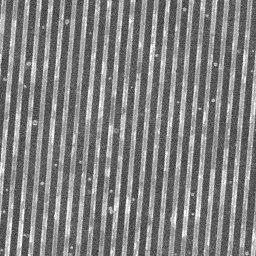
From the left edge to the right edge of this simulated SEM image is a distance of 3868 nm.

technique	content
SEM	parallel lines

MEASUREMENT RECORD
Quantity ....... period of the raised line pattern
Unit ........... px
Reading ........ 11.7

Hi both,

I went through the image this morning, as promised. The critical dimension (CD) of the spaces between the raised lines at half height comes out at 117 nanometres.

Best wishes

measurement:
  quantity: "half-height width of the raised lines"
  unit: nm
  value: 62.1